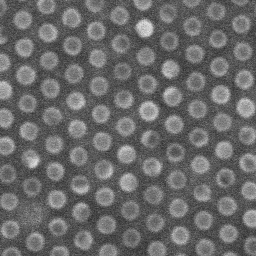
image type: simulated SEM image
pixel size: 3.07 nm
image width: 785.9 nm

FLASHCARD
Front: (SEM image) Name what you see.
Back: a regular array of raised bodies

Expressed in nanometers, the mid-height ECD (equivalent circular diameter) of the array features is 51.3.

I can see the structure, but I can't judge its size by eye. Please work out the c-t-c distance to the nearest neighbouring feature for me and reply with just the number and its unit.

0.0848 microns